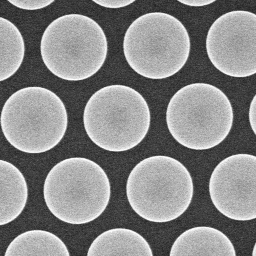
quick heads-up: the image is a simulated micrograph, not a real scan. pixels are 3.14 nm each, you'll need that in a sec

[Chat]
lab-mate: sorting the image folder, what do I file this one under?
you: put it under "an array of small figures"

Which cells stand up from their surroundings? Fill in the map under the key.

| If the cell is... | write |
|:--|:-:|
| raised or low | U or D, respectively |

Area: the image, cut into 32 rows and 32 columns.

DDUUUUDDDDDDUUUUDDDDDDDUUUDDDDDD
DDDDDDDDDDDDDDDDDDDDDDDDDDDDDUUD
UDDDDDDUUUUDDDDDDUUUUUDDDDDUUUUU
UUDDDDUUUUUUUDDDUUUUUUUDDDUUUUUU
UUUDDUUUUUUUUDDDUUUUUUUDDDUUUUUU
UUUDDUUUUUUUUDDUUUUUUUUUDDUUUUUU
UUUDDUUUUUUUUDDDUUUUUUUUDDUUUUUU
UUUDDUUUUUUUUDDDUUUUUUUDDDUUUUUU
UUDDDDUUUUUUDDDDDUUUUUUDDDDUUUUU
UDDDDDDUUUUDDDDDDDUUUDDDDDDDDUUD
DDDDDDDDDDDDDDDDDDDDDDDDDUDDDDDD
DDUUUUDDDDDDUUUUUDDDDDUUUUUUDDDD
DUUUUUUUDDDUUUUUUUDDDUUUUUUUDDDD
UUUUUUUUDDDUUUUUUUDDDUUUUUUUUDDU
UUUUUUUUDDDUUUUUUUUDDUUUUUUUUDDU
UUUUUUUUDDDUUUUUUUUDDUUUUUUUUDDU
UUUUUUUUDDDUUUUUUUDDDUUUUUUUUDDD
DUUUUUUUDDDDUUUUUUDDDDUUUUUUDDDD
DDUUUUDDDDDDDUUUDDDDDDDDUUDDDDDD
DDDDDDDDDDDDDDDDDDDDDDDDDDDDDUUU
UDDDDDDUUUUUDDDDDUUUUUUDDDDUUUUU
UUDDDDUUUUUUUDDDUUUUUUUDDDDUUUUU
UUUDDDUUUUUUUDDDUUUUUUUUDDUUUUUU
UUUDDDUUUUUUUUDDUUUUUUUUDDUUUUUU
UUUDDDUUUUUUUUDDUUUUUUUUDDUUUUUU
UUUDDDUUUUUUUDDDUUUUUUUUDDDUUUUU
UUUDDDUUUUUUUDDDDUUUUUUDDDDDUUUU
UUDDDDDDUUUUDDDDDDDUUDDDDDDDDDDD
DDDDDDDDDDDDDDDDDDDDDDDDUUDDDDDD
DDUUUUUDDDDDUUUUUUDDDDUUUUUUDDDD
DUUUUUUUDDDDUUUUUUDDDDUUUUUUUDDD
DUUUUUUUDDDUUUUUUUUDDUUUUUUUUDDD